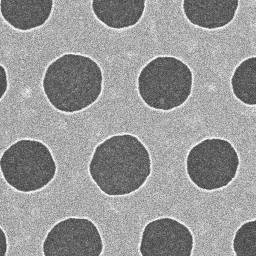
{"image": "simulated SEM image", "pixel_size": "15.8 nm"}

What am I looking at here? holes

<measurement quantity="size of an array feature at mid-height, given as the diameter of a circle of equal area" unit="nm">886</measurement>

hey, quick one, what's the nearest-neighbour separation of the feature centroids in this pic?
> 1460 nanometers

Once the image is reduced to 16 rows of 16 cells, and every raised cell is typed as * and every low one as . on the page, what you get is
...***...**....*
*..****.****..**
****************
****.***********
***...***...***.
***...***...***.
***...***..*****
****************
*******.********
...***...***...*
...***...***...*
*..***...***..**
****************
****************
***...***...***.
***...***...***.